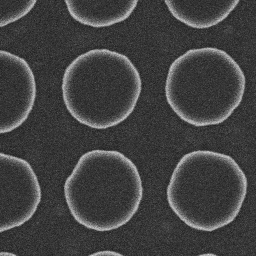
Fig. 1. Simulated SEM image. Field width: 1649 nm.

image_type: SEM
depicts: raised bodies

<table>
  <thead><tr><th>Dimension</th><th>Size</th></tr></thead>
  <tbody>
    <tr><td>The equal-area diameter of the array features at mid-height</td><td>501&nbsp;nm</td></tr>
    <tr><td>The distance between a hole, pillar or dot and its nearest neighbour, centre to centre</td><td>103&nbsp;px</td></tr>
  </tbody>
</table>